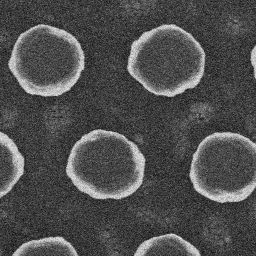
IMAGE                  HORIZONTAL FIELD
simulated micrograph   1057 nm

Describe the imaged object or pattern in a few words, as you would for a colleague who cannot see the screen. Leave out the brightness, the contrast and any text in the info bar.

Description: raised bodies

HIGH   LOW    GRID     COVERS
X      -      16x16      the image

----------------
----------------
-XXXX----XXX----
-XXXX---XXXXX---
-XXXX---XXXXX---
--XX-----XXX----
----------------
----------------
------XX-----XX-
X---XXXXX---XXXX
X---XXXXX---XXXX
X----XXXX---XXXX
--------------X-
----------------
----------------
-XXXX----XXX----